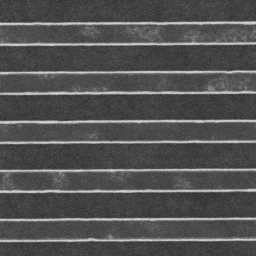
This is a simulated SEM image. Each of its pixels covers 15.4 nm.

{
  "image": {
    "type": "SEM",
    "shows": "parallel lines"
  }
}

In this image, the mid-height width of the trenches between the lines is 434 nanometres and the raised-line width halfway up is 324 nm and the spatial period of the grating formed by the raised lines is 753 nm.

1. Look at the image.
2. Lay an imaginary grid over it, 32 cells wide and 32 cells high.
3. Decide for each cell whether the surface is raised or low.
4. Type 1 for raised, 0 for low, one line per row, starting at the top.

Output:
00000000000000000000000000000000
00000000000000000000000000000000
00000000000000000000000000000000
11111111111111111111111111111111
11111111111111111111111111111111
01110111111111111111000000000000
00000000000000000000000000000000
00000000000000000000000000000000
00000000000000000000000000000000
11111111111111111111111111111111
11111111111111111111111111111111
11111111111111111111111111111111
00000000000000000000000000000000
00000000000000000000000000000000
00000000000000000000000000000000
11111111111111111111111111111111
11111111111111111111111111111111
11111111111111111111111111111111
00000000000000000000000000000000
00000000000000000000000000000000
00000000000000000000000000000000
11111111111111111111111111111111
11111111111111111111111111111111
11111111111111111111111111111111
00000000000000000000000000000000
00000000000000000000000000000000
00000000000000000000000000000000
00000000010000111111111111111111
11111111111111111111111111111111
11111111111111111111111111111111
00000000000000000000000000000000
00000000000000000000000000000000